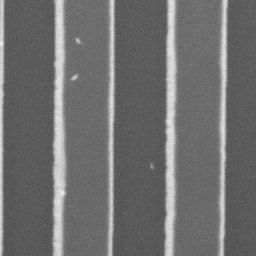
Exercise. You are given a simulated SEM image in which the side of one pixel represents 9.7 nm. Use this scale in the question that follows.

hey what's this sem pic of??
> lines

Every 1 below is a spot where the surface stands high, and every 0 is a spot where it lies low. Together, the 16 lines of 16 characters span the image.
0000111000011100
0000111000011100
0000111000011100
0000111000011100
0000111000011100
0000111000011100
0000111000011100
0000111000011100
0000111000011100
0000111000011100
0000111000011100
0000111000011100
0000111000011100
0000111000011100
0001111000111100
0001111000111100